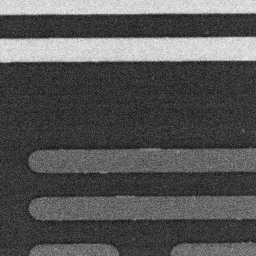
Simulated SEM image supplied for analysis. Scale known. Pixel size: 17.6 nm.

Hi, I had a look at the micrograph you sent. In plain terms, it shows groups of lines, slits or small figures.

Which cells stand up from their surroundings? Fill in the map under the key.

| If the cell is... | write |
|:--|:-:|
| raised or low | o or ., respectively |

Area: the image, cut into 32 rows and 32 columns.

oooooooooooooooooooooooooooooooo
oooooooooooooooooooooooooooooooo
................................
................................
................................
oooooooooooooooooooooooooooooooo
oooooooooooooooooooooooooooooooo
ooooooooooooooooooooooooo.......
................................
................................
................................
................................
................................
................................
................................
................................
................................
................................
................................
....oooooooooooooooooooooooooooo
....oooooooooooooooooooooooooooo
.....ooooooooooooo..............
................................
................................
................................
....oooooooooooooooooooooooooooo
....oooooooooooooooooooooooooooo
................................
................................
................................
............................oooo
....ooooooooooo......ooooooooooo